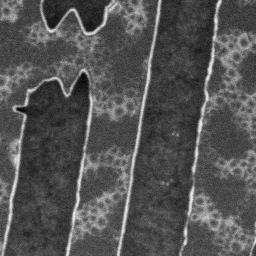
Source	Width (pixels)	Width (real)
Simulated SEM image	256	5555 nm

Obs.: one or a few lines or trenches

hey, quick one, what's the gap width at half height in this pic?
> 1340 nanometers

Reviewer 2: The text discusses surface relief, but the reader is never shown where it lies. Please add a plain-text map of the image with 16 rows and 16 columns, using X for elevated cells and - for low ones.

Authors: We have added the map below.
XXX----XXX----XX
XXX-X-XXXX---XXX
XXXXXXXXXX---XXX
XXXXXXXXX----XXX
XXXXXXXXX----XXX
XX----XXX----XXX
X-----XXX----XXX
X-----XXX----XXX
X----XXXX---XXXX
X----XXX----XXXX
X----XXX----XXXX
X----XXX----XXXX
X----XXX----XXXX
X----XXX----XXXX
----XXXX----XXXX
----XXX----XXXXX